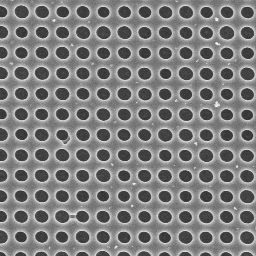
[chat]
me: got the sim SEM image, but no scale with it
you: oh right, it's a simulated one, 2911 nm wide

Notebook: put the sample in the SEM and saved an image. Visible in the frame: a regular array of holes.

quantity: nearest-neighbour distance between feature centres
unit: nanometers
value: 231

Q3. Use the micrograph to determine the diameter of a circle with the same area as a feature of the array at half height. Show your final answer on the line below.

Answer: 142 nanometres